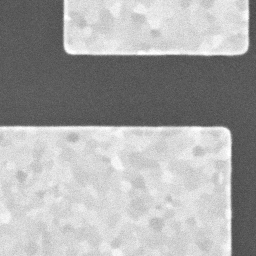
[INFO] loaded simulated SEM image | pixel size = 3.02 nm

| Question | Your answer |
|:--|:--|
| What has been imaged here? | wiring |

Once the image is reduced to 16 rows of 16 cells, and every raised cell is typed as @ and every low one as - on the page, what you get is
----@@@@@@@@@@@@
----@@@@@@@@@@@@
----@@@@@@@@@@@@
----------------
----------------
----------------
----------------
----------------
@@@@@@@@@@@@@@--
@@@@@@@@@@@@@@--
@@@@@@@@@@@@@@--
@@@@@@@@@@@@@@--
@@@@@@@@@@@@@@--
@@@@@@@@@@@@@@--
@@@@@@@@@@@@@@--
@@@@@@@@@@@@@@--